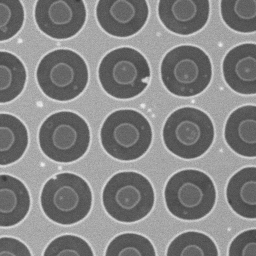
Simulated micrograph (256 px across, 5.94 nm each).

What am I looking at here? an array of small figures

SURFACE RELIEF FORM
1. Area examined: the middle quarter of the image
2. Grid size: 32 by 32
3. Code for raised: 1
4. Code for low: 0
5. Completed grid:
10000011100001111000011100001111
11000011000011111100001100001111
11000011000011111100001100001111
11000011100001111100011100001111
11000011100000111000011110000111
00000011100000000000011110000000
00000111110000000000111111000000
00001111111000000001111111100000
00011111111110000111111111111111
11111111111111111111111111111111
11111111111111111111111111111111
11111111111110000111111111110000
00011111111000000001111111100000
00000111111000000000111111000000
00000011110000000000011110000010
10000011100000111000001110000111
11000001100001111100001110001111
11100001100001111110001110001111
11100001100001111100001110000111
11100001100001111100001110000111
11000011110000000000001110000000
00000011110000000000011111000000
00000111111000000000111111100000
00001111111100000001111111111000
00111111111111111111111111111111
11111111111111111111111111111111
11111111111111111111111111111100
00011111111110000001111111100000
00000111111100000000011111000000
00000011111000000000001111000000
00000011110000000000001110000011
11000001110000111100001110000111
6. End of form